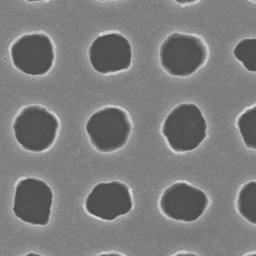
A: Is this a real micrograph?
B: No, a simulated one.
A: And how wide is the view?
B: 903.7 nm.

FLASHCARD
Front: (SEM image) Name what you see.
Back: a regular array of holes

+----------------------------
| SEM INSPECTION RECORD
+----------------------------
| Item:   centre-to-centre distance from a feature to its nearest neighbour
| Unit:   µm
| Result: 0.256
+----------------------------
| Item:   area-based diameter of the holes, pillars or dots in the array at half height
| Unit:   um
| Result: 0.146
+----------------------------